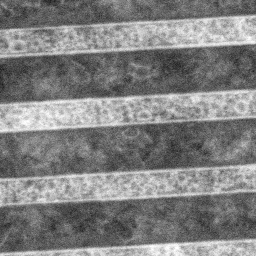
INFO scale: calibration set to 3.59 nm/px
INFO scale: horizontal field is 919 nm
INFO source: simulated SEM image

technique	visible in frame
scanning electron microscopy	one or a few lines or trenches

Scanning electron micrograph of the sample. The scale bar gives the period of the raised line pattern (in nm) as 267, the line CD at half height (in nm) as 94.5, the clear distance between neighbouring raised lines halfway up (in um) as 0.174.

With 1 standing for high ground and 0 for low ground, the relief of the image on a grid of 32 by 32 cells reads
00000000000000000000000000000000
00000000000000000000000000000000
00000000000000000000000011111111
00000001111111111111111111111111
11111111111111111111111111111111
11111111111111111111111111110000
11111111111000000000000000000000
00000000000000000000000000000000
00000000000000000000000000000000
00000000000000000000000000000000
00000000000000000000000000000000
00000000000000000000000000000111
00000000000111111111111111111111
11111111111111111111111111111111
11111111111111111111111111111111
11111111111111100000000000000000
00000000000000000000000000000000
00000000000000000000000000000000
00000000000000000000000000000000
00000000000000000000000000000000
00000000000000000000000000000000
00000000000000000011111111111111
11111111111111111111111111111111
11111111111111111111111111111111
11111111111111111111000000000000
11000000000000000000000000000000
00000000000000000000000000000000
00000000000000000000000000000000
00000000000000000000000000000000
00000000000000000000000000000000
00000000000000000000000011111111
00000011111111111111111111111111